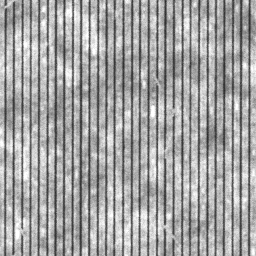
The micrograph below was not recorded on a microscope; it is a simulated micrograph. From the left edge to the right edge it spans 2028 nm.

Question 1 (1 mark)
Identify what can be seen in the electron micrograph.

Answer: parallel lines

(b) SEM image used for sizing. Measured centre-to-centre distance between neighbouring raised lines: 66.5 nanometers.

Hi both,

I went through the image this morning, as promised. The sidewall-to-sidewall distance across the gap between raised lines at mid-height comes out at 0.0158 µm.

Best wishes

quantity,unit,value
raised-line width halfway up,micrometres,0.0535